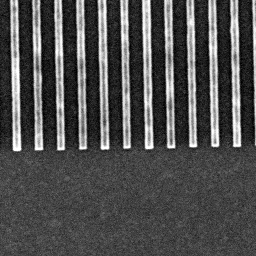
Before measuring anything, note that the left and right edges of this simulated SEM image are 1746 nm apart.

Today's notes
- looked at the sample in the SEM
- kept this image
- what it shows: parallel lines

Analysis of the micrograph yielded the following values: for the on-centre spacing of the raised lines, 150 nm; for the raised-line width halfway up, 46.9 nanometres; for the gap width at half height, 106 nanometres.